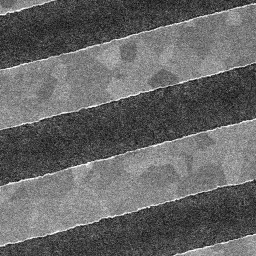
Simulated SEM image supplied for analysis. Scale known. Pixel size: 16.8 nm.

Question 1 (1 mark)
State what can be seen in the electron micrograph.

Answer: one or a few lines or trenches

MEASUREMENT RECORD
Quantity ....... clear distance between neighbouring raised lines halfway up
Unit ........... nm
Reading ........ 901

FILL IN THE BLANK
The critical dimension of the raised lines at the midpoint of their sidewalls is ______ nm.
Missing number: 980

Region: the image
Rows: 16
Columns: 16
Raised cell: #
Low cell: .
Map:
##.............#
...........#####
.......#########
....############
##############..
##########......
######..........
###.............
............####
........########
....############
.##############.
###########.....
#######.........
####............
.............###